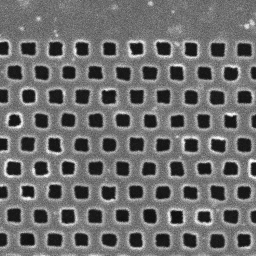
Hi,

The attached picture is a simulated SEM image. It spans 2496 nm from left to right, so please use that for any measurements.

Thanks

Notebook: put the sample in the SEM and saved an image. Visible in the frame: a regular array of holes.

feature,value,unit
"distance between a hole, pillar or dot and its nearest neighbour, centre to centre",259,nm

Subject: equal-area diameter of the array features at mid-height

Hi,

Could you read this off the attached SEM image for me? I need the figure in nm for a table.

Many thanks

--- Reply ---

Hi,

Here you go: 148